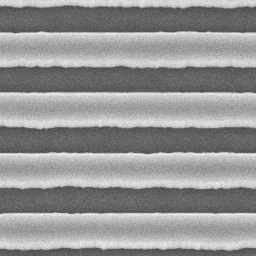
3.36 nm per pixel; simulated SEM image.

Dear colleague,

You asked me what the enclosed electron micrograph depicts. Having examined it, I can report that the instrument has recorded lines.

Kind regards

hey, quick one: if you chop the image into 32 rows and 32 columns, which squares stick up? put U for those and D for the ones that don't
UUUUUUUUDDUUUUUUUUUUUUUUUUUUUUUU
DDDDDDDDDDDDDDDDDDDDDDDDDDDDDDDD
DDDDDDDDDDDDDDDDDDDDDDDDDDDDDDDD
DDDDDDDDDDDDDDDDDDDDDDDDDDDDDDDD
UUUUUUUUUUUUUUUUUUUUUUUUUUUUUUUU
UUUUUUUUUUUUUUUUUUUUUUUUUUUUUUUU
UUUUUUUUUUUUUUUUUUUUUUUUUUUUUUUU
UUUUUUUUUUUUUUUUUUUUUUUUUUUUUUUU
DDDDDDDDDDDDDDDDDDDDDDDDDDDDDDDD
DDDDDDDDDDDDDDDDDDDDDDDDDDDDDDDD
DDDDDDDDDDDDDDDDDDDDDDDDDDDDDDDD
DDDDDDDDDDDDDDDDDDDDDDDDDDDDDDDD
UUUUUUUUUUUUUUUUUUUUUUUUUUUUUUUU
UUUUUUUUUUUUUUUUUUUUUUUUUUUUUUUU
UUUUUUUUUUUUUUUUUUUUUUUUUUUUUUUU
UUUUUUUUUUUUUUUUUUUUUUUUUUUUUUUU
DDDDDDDDDDDDDDDDDDDDDDDDDDDDDDDD
DDDDDDDDDDDDDDDDDDDDDDDDDDDDDDDD
DDDDDDDDDDDDDDDDDDDDDDDDDDDDDDDD
UUUUUUUUUUUUUUUUUUUUUUUUUUUUUUUU
UUUUUUUUUUUUUUUUUUUUUUUUUUUUUUUU
UUUUUUUUUUUUUUUUUUUUUUUUUUUUUUUU
UUUUUUUUUUUUUUUUUUUUUUUUUUUUUUUU
DDDDDDDDDDDDDDDDDDDDDDDDDDDDDDDD
DDDDDDDDDDDDDDDDDDDDDDDDDDDDDDDD
DDDDDDDDDDDDDDDDDDDDDDDDDDDDDDDD
DDDDDDDDDDDDDDDDDDDDDDDDDDDDDDDD
UUUUUUUUUUUUUUUUUUUUUUUUUUUUUUUU
UUUUUUUUUUUUUUUUUUUUUUUUUUUUUUUU
UUUUUUUUUUUUUUUUUUUUUUUUUUUUUUUU
UUUUUUUUUUUUUUUUUUUUUUUUUUUUUUUU
DDDDDDDDDDDDDDDDDDDDDDDDDDDDDDDD